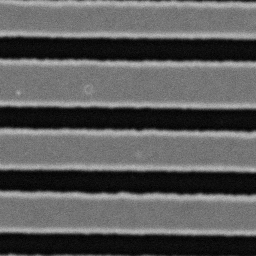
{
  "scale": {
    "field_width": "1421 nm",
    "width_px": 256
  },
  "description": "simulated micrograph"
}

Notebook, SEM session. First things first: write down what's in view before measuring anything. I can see lines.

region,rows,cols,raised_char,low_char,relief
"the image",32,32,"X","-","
XXXXXXXXXXXXXXXXXXXXXXXXXXXXXXXX
XXXXXXXXXXXXXXXXXXXXXXXXXXXXXXXX
XXXXXXXXXXXXXXXXXXXXXXXXXXXXXXXX
XXXXXXXXXXXXXXXXXXXXXXXXXXXXXXXX
------XXXXXXXXXXXXXXXXXXXXXXXXXX
--------------------------------
--------------------------------
--------------------------------
XXXXXXXXXXXXXXXXXXXXXXXXXXXXXXXX
XXXXXXXXXXXXXXXXXXXXXXXXXXXXXXXX
XXXXXXXXXXXXXXXXXXXXXXXXXXXXXXXX
XXXXXXXXXXXXXXXXXXXXXXXXXXXXXXXX
XXXXXXXXXXXXXXXXXXXXXXXXXXXXXXXX
--------------------------------
--------------------------------
--------------------------------
XXXXXXXXXXXXXXXXXXXXXXXXXXXXXX--
XXXXXXXXXXXXXXXXXXXXXXXXXXXXXXXX
XXXXXXXXXXXXXXXXXXXXXXXXXXXXXXXX
XXXXXXXXXXXXXXXXXXXXXXXXXXXXXXXX
XXXXXXXXXXXXXXXXXXXXXXXXXXXXXXXX
--------------------------------
--------------------------------
--------------------------------
XXXXXXXXXXXXXXXXXXXXXXXXXXXX----
XXXXXXXXXXXXXXXXXXXXXXXXXXXXXXXX
XXXXXXXXXXXXXXXXXXXXXXXXXXXXXXXX
XXXXXXXXXXXXXXXXXXXXXXXXXXXXXXXX
XXXXXXXXXXXXXXXXXXXXXXXXXXXXXXXX
--------------------------------
--------------------------------
--------------------------------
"